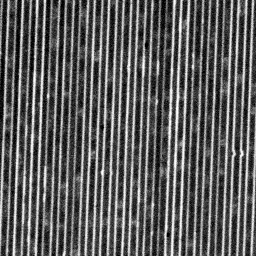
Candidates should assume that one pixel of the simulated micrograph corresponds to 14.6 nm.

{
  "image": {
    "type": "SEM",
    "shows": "parallel lines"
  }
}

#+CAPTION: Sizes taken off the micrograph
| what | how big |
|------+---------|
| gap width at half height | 87.6 nm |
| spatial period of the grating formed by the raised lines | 210 nm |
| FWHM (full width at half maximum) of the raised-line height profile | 124 nm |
